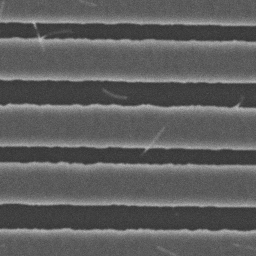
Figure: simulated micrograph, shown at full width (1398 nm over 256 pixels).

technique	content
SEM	lines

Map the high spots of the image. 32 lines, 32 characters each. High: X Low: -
XXXXXXXXXXXXXXXXXXXXXXXXXXXXXXXX
XXXXXXXXXXXXXXXXXXXXXXXXXXXXXXXX
XXXXXXXXXXXXXXXXXXXXXXXXXXXXXXXX
--------------------------------
--------------------------------
XXXXXXXXXXXXXXXXXXXXXXXXXXXXXXXX
XXXXXXXXXXXXXXXXXXXXXXXXXXXXXXXX
XXXXXXXXXXXXXXXXXXXXXXXXXXXXXXXX
XXXXXXXXXXXXXXXXXXXXXXXXXXXXXXXX
XXXXXXXXXXXXXXXXXXXXXXXXXXXXXXXX
--------------------------------
--------------------------------
--------------------------------
XXXXXXXXXXXXXXXXXXXXXXXXXXXX-X--
XXXXXXXXXXXXXXXXXXXXXXXXXXXXXXXX
XXXXXXXXXXXXXXXXXXXXXXXXXXXXXXXX
XXXXXXXXXXXXXXXXXXXXXXXXXXXXXXXX
XXXXXXXXXXXXXXXXXXXXXXXXXXXXXXXX
------------------X-XX-XXXXXXXXX
--------------------------------
XXXXXXXXXX--XXXX----------------
XXXXXXXXXXXXXXXXXXXXXXXXXXXXXXXX
XXXXXXXXXXXXXXXXXXXXXXXXXXXXXXXX
XXXXXXXXXXXXXXXXXXXXXXXXXXXXXXXX
XXXXXXXXXXXXXXXXXXXXXXXXXXXXXXXX
---XXXX--XXXXXXXXXXXXXXXXXXXXXXX
--------------------------------
--------------------------------
--------------------------------
XXXXXXXXXXXXXXXXXXXXXXXXXXXXXXXX
XXXXXXXXXXXXXXXXXXXXXXXXXXXXXXXX
XXXXXXXXXXXXXXXXXXXXXXXXXXXXXXXX